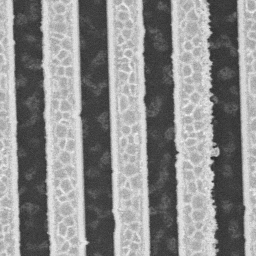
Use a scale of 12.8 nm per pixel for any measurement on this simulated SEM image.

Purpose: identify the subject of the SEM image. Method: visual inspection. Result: one or a few lines or trenches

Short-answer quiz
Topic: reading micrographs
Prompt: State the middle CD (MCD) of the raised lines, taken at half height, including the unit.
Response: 0.38 micrometres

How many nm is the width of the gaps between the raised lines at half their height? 448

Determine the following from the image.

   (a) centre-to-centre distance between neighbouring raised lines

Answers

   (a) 833 nanometers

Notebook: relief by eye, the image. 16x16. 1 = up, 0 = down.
1001100110011001
1001100110011001
1001100110011001
1001100110011001
1001100110011001
1001100110011001
1001100110011001
1001100110011001
1001100110011001
1001100110011001
1001100110011001
1001100110011001
1001100110011001
1001100110011001
1001100110011001
1001100110011000